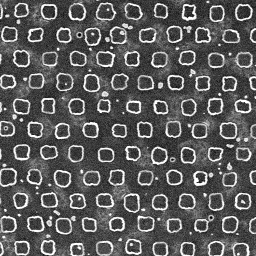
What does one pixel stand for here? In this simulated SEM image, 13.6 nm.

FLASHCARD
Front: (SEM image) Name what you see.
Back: a regular array of raised bodies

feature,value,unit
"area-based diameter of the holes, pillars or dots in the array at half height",0.216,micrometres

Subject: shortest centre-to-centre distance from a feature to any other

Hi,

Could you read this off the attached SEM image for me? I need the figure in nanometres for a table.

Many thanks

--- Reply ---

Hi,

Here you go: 355